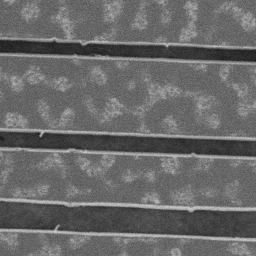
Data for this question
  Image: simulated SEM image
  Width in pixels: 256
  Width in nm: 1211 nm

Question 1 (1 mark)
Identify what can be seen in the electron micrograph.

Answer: one or a few lines or trenches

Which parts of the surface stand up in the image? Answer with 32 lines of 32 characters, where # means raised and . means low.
################################
################################
################################
################################
################################
..........#........#############
................................
#####################...........
################################
################################
################################
################################
################################
################################
################################
################################
.....#..########################
................................
................................
#########################.......
################################
################################
################################
################################
################################
........####.###################
................................
................................
................................
#####################...........
################################
################################